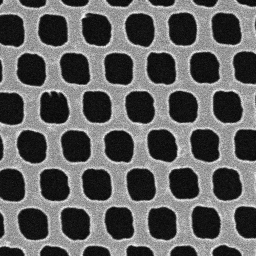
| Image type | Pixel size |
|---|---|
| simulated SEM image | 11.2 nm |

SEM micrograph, a regular array of holes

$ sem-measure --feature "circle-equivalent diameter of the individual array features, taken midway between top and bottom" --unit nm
363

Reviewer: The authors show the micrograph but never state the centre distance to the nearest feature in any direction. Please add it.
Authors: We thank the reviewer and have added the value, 479 nm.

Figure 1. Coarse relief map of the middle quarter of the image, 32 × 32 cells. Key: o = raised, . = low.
......oooo.......oooo.......oooo
......oooo.......oooo.......ooo.
......oooo.......oooo.......oooo
.......ooo.......oooo.......oooo
o.....ooooo......ooooo......oooo
oooooooooooooooooooooooooooooooo
oooooooooooooooooooooooooooooooo
ooooo......ooooo.....oooooo.....
.oooo......oooo.......oooo......
.oooo.......ooo........ooo......
.oooo.......ooo.......oooo......
.oooo.......ooo........ooo......
.oooo.......oooo.......ooo......
.oooo.......oooo......ooooo.....
oooooo.....oooooo....ooooooo....
oooooooooooooooooooooooooooooooo
o..ooooooooooooooooooo....oooooo
......ooooo.....ooooo......ooooo
......oooo.......oooo.......ooo.
.......ooo.......oooo.......oooo
.......ooo.......oooo.......oooo
.......ooo........ooo.......oooo
.......ooo.......oooo.......oooo
......ooooo......ooooo......oooo
o.....ooooooo.o.ooooooooo..ooooo
oooooooooooooooooooooooooooooooo
ooooo.....ooooooo....oooooo.....
oooo.......ooooo......oooo......
.ooo........oooo.......ooo......
.ooo........oooo.......ooo......
.oooo.......oooo.......ooo......
..ooo.......oooo.......ooo......